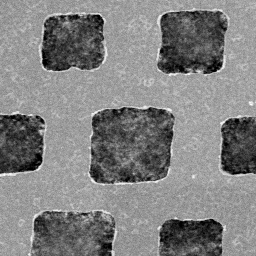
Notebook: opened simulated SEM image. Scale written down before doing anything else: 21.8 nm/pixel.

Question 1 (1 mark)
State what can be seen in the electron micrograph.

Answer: holes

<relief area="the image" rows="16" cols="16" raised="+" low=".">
++++++++++++++++
+++...++++....++
+++....+++....++
+++....+++....++
++++++++++...+++
++++++++++++++++
++++++++++++++++
...+++.....+++..
...+++.....+++..
...+++.....+++..
..++++.....+++..
++++++++++++++++
++++++++++++++++
++.....+++++++++
++.....+++....++
++.....+++....++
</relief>